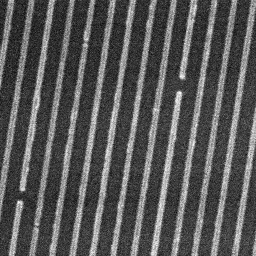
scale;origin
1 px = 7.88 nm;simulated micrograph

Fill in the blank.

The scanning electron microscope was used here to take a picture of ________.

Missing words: parallel lines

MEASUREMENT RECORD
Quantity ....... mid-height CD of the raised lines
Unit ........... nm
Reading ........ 28.2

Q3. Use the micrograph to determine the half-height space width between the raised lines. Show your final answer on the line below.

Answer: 126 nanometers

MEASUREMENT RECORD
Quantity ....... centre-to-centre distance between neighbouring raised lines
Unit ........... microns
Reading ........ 0.158